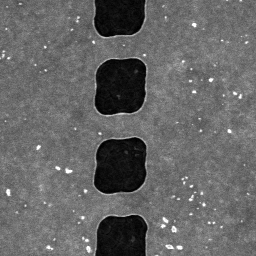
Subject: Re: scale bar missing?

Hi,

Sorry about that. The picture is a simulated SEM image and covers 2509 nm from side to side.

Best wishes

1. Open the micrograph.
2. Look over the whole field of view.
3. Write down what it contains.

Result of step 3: holes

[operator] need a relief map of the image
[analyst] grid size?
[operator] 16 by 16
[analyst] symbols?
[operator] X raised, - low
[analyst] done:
XXXXXX---XXXXXXX
XXXXXX---XXXXXXX
XXXXXXXXXXXXXXXX
XXXXXXXXXXXXXXXX
XXXXXX---XXXXXXX
XXXXXX---XXXXXXX
XXXXXX---XXXXXXX
XXXXXXXXXXXXXXXX
XXXXXXXXXXXXXXXX
XXXXXX---XXXXXXX
XXXXXX---XXXXXXX
XXXXXX---XXXXXXX
XXXXXXXXXXXXXXXX
XXXXXXXX-XXXXXXX
XXXXXX---XXXXXXX
XXXXXX---XXXXXXX